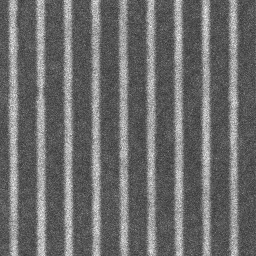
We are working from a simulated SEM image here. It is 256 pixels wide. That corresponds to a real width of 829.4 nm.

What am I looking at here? parallel lines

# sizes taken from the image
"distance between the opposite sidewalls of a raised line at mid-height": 19.9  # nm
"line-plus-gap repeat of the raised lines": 89.3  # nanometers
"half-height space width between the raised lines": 70.9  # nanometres